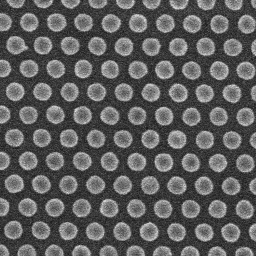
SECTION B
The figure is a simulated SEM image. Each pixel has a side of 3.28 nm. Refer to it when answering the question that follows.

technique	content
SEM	a regular array of raised bodies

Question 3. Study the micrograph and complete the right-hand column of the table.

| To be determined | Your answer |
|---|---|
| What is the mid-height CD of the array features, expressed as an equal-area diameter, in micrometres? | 0.0578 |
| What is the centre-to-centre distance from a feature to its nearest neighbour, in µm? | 0.0872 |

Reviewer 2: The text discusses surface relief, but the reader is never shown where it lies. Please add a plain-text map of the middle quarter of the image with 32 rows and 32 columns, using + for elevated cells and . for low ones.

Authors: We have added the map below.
...++++..++++...++++...++++...++
...++++..+++++..+++++..++++...++
...+++....+++....+++...++++...++
........................++.....+
................................
+++....++....+++....+++....+++..
++++..++++...++++...++++..+++++.
++++..++++...++++...++++..+++++.
+++....+++...++++...+++....+++..
................................
................................
...+++....+++....+++...+++.....+
...++++..+++++..++++...++++...++
...++++..+++++..++++...++++...++
...+++....+++....+++...++++...++
................................
+...............................
+++...++++...+++....+++....+++..
+++...++++...++++..+++++..++++..
+++...++++...++++...++++..++++..
++.....++.....++....+++....+++..
................................
...+++....++.....++............+
..++++...++++...++++...++++...++
...++++..++++...++++...++++...++
...+++....+++...++++...++++...++
...........+......+.....++.....+
................................
++....+++.....++....+++....++...
+++...++++...++++...+++...++++..
+++...++++..+++++...++++..++++..
+++...++++...+++....+++...++++..